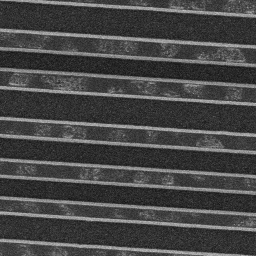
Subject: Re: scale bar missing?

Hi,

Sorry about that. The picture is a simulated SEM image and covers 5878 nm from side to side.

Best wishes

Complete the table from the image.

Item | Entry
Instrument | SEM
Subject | parallel lines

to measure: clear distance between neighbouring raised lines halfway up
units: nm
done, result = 559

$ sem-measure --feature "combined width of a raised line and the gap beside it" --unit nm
951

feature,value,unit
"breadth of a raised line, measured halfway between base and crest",398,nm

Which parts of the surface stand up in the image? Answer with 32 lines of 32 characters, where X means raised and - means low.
----------XXXXXXXXXXXXXXXXXXXXXX
-------------------------XXXXXXX
--------------------------------
--------------------------------
XXXXXXXXXX----------------------
XXXXXXXXXXXXXXXXXXXXXXXXX-------
-------XXXXXXXXXXXXXXXXXXXXXXXXX
----------------------XXXXXXXXXX
--------------------------------
XXXXXXXXXXXX--------------------
XXXXXXXXXXXXXXXXXXXXXXXXXXX-----
--------XXXXXXXXXXXXXXXXXXXXXXXX
------------------------XXXXXXXX
--------------------------------
--------------------------------
XXXXXXXXXX----------------------
XXXXXXXXXXXXXXXXXXXXXXXX--------
---------XXXXXXXXXXXXXXXXXXXXXXX
------------------------XXXXXXXX
--------------------------------
XXXXXXX-------------------------
XXXXXXXXXXXXXXXXXXXXXX----------
-------XXXXXXXXXXXXXXXXXXXXXXXXX
-----------------------XXXXXXXXX
--------------------------------
XXXXXXXXXX----------------------
XXXXXXXXXXXXXXXXXXXXXXXXX-------
--------------XXXXXXXXXXXXXXXXXX
-----------------------------XXX
--------------------------------
XXXXX---------------------------
XXXXXXXXXXXXXXXXXXXXX-----------